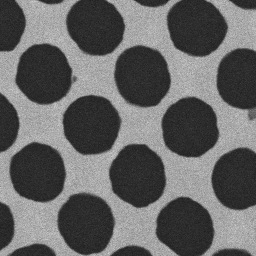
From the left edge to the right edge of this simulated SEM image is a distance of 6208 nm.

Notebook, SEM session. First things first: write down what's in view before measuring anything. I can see holes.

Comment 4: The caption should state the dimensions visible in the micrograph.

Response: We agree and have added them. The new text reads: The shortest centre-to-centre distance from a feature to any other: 1.7 µm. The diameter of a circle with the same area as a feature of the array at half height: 1420 nm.